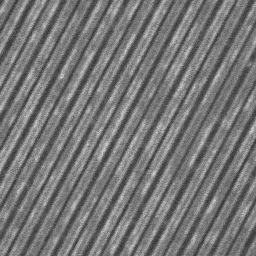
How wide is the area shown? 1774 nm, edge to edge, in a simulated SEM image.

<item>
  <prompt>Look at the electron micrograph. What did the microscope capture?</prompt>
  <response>parallel lines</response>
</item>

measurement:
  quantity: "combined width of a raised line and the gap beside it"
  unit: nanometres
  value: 95.8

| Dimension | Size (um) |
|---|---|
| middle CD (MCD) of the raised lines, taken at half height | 0.055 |